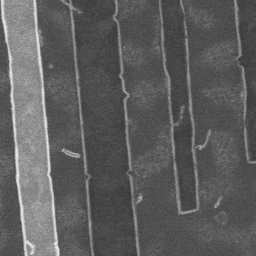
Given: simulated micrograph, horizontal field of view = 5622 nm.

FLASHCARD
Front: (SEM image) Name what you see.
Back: one or a few lines or trenches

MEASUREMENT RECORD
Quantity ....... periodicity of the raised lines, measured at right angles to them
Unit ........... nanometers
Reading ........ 1650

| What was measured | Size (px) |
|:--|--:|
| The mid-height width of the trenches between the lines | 43.7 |